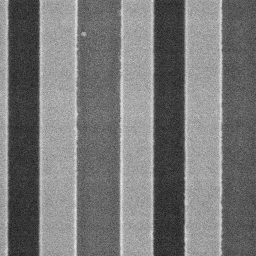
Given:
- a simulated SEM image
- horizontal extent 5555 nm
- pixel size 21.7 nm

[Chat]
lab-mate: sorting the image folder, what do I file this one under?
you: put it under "lines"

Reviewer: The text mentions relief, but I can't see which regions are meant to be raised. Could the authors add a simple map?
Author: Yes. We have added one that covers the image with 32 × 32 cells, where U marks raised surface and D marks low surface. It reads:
UDDDDUUUUUDDDDDUUUUDDDDUUUUUDDDD
UDDDDUUUUUDDDDDUUUUDDDDUUUUUDDDD
UDDDDUUUUUDDDDDUUUUDDDDUUUUUDDDD
UDDDDUUUUUDDDDDUUUUDDDDUUUUUDDDD
UDDDDUUUUUDDDDDUUUUDDDDUUUUUDDDD
UDDDDUUUUDDDDDDUUUUDDDDUUUUUDDDD
UDDDDUUUUDDDDDDUUUUDDDDUUUUUDDDD
UDDDDUUUUUDDDDDUUUUDDDDUUUUUDDDD
UDDDDUUUUUDDDDDUUUUDDDDUUUUUDDDD
UDDDDUUUUUDDDDDUUUUDDDDUUUUUDDDD
UDDDDUUUUDDDDDDUUUUDDDDUUUUUDDDD
UDDDDUUUUUDDDDDUUUUDDDDUUUUUDDDD
UDDDDUUUUDDDDDDUUUUDDDDUUUUUDDDD
UDDDDUUUUDDDDDDUUUUDDDDUUUUUDDDD
UDDDDUUUUDDDDDDUUUUDDDDUUUUUDDDD
UDDDDUUUUDDDDDDUUUUDDDDUUUUUDDDD
UDDDDUUUUUDDDDDUUUUDDDDUUUUUDDDD
UDDDDUUUUDDDDDDUUUUDDDDUUUUUDDDD
UDDDDUUUUDDDDDDUUUUDDDDUUUUUDDDD
UDDDDUUUUDDDDDDUUUUDDDDUUUUUDDDD
UDDDDUUUUDDDDDDUUUUDDDDUUUUUDDDD
UDDDDUUUUDDDDDDUUUUDDDDUUUUUDDDD
UDDDDUUUUDDDDDDUUUUDDDDUUUUUDDDD
UDDDDUUUUDDDDDDUUUUDDDDUUUUUDDDD
UDDDDUUUUDDDDDDUUUUDDDDUUUUUDDDD
UDDDDUUUUDDDDDDUUUUDDDDUUUUUDDDD
UDDDDUUUUDDDDDDUUUUDDDDUUUUUDDDD
UDDDDUUUUDDDDDDUUUUDDDDUUUUUDDDD
UDDDDUUUUDDDDDDUUUUDDDDUUUUUDDDD
UDDDDUUUUDDDDDDUUUUDDDDUUUUUDDDD
UDDDDUUUUDDDDDDUUUUDDDDUUUUUDDDD
UDDDDUUUUDDDDDDUUUUDDDDUUUUUDDDD